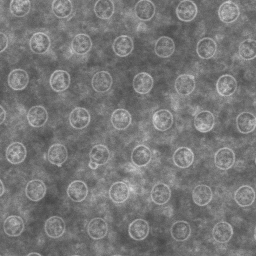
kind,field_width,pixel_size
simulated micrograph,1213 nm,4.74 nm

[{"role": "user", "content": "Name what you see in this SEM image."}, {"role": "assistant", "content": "a regular array of raised bodies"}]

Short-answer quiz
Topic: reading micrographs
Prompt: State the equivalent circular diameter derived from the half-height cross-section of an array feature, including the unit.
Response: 95.6 nm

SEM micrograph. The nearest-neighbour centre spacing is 0.197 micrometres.